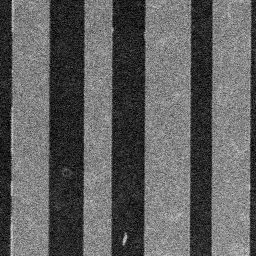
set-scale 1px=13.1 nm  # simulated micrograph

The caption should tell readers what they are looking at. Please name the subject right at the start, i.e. one or a few lines or trenches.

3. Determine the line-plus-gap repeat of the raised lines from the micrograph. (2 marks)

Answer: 878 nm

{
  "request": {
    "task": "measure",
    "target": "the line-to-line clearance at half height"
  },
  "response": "446 nanometres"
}